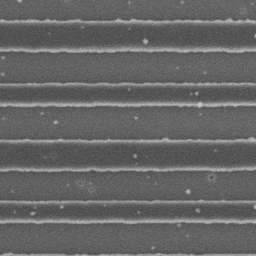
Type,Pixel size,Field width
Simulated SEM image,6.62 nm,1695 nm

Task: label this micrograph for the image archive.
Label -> lines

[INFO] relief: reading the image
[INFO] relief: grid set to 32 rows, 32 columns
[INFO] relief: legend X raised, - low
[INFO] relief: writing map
--------------------------------
--------------------------------
--------------------------------
XXXXXXXXXXXXXXXXXXXXXXXXXXXXXXXX
XXXXXXXXXXXXXXXXXXXXXXXXXXXXXXXX
XXXXXXXXXXXXXXXXXXXXXXXXXXXXXXXX
--------------------------------
--------------------------------
--------------------------------
--------------------------------
---XXXXXXXX-XX-XX-XXXXXXXXXXXXXX
XXXXXXXXXXXXXXXXXXXXXXXXXXXXXXXX
XXXXXXXXXXXXXXXXXXXXXXXXXXXXXXXX
--------------------------------
--------------------------------
--------------------------------
--------------------------------
---X---X---------------XX----XX-
XXXXXXXXXXXXXXXXXXXXXXXXXXXXXXXX
XXXXXXXXXXXXXXXXXXXXXXXXXXXXXXXX
XXXXXXXXXXXXXXXXXXXXXXXXXXXXXXXX
--------------------------------
--------------------------------
--------------------------------
--------------------------------
XXXXXXXXXXXXXXXXXXXXXXXXXXXXXXXX
XXXXXXXXXXXXXXXXXXXXXXXXXXXXXXXX
XXXXXXXXXXXXXXXXXXXXXXXXXXXXXXXX
--------------------------------
--------------------------------
--------------------------------
--------------------------------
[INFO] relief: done